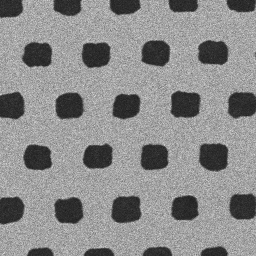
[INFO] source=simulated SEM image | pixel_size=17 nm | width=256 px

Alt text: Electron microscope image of a regular array of holes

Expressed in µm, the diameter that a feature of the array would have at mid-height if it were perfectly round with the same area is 0.477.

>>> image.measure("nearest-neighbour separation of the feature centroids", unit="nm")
977